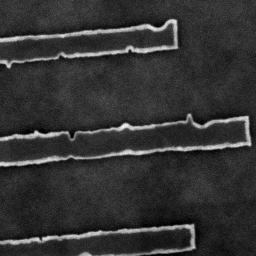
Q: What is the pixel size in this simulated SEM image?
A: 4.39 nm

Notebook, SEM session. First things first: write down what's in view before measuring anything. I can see one or a few lines or trenches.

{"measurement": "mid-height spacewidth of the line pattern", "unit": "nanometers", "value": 328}